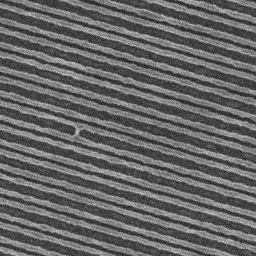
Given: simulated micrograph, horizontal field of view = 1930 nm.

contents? parallel lines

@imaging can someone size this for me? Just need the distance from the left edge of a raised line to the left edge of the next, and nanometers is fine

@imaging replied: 87.9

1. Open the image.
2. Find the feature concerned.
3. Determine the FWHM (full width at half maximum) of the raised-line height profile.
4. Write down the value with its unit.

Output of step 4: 35.3 nm